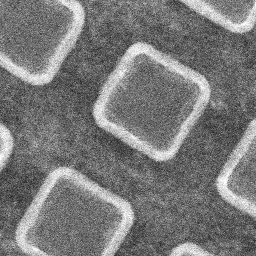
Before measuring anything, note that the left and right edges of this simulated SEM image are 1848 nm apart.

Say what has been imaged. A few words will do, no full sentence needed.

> raised bodies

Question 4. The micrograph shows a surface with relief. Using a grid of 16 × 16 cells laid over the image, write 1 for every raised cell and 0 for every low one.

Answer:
1111100000000111
1111100000000011
1111000000000000
1111000011000000
0110000111110000
0000000111111000
0000001111111000
0000001111110000
0000000011100000
0000000001100001
0000000000000011
0001110000000011
0011111000000001
0011111100000000
0111111100000000
0011111000000000